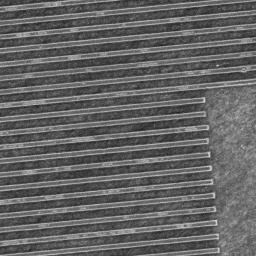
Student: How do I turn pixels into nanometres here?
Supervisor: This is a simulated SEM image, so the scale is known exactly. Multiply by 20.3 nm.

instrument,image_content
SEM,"parallel lines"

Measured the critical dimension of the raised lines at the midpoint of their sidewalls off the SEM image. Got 88.4 nm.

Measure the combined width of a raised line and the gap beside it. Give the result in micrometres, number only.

0.278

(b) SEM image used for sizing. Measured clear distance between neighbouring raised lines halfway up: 179 nm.